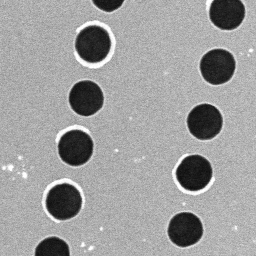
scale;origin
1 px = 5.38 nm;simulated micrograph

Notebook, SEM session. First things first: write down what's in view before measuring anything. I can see a regular array of holes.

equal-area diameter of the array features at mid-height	191	nanometers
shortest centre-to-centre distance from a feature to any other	53.4	pixels